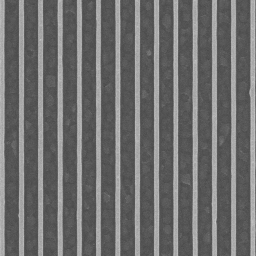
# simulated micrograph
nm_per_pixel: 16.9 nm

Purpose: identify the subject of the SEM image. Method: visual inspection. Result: parallel lines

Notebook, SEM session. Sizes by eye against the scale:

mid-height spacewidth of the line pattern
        0.251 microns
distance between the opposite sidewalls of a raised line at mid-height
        0.078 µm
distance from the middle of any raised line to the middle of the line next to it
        325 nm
